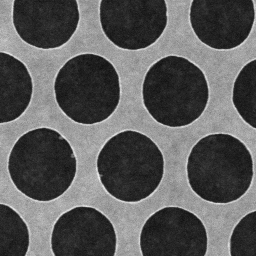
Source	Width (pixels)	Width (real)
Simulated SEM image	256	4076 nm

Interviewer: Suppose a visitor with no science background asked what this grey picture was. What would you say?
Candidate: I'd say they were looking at holes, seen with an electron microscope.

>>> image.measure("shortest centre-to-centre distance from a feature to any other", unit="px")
87.7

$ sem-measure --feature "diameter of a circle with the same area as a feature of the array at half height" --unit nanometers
1090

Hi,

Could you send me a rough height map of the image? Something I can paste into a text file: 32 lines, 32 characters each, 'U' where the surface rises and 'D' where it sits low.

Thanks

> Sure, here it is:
UUDDDDDDDDUUUDDDDDDDDUUUDDDDDDDD
UUDDDDDDDDUUDDDDDDDDDUUUDDDDDDDD
UUDDDDDDDDUUUDDDDDDDDUUUDDDDDDDD
UUDDDDDDDDUUUDDDDDDDDUUUDDDDDDDD
UUDDDDDDDUUUUDDDDDDDUUUUUDDDDDDU
UUUUDDDDUUUUUUDDDDDUUUUUUUDDDDUU
UUUUUUUUUUUUUUUUUUUUUUUUUUUUUUUU
DDUUUUUUUDDDDUUUUUUUDDDUUUUUUUUU
DDDUUUUUDDDDDDUUUUUDDDDDDUUUUUDD
DDDDUUUDDDDDDDDUUUDDDDDDDUUUUUDD
DDDDUUUDDDDDDDDUUUDDDDDDDDUUUDDD
DDDDUUUDDDDDDDDUUUDDDDDDDDUUUDDD
DDDDUUUDDDDDDDDUUUDDDDDDDDUUUDDD
DDDUUUUUDDDDDDUUUUDDDDDDDDUUUDDD
DDUUUUUUDDDDDDUUUUUDDDDDDUUUUUDD
UUUUUUUUUUUUUUUUUUUUDDDDUUUUUUUD
UUUUDDDUUUUUUUUDDUUUUUUUUUUUUUUU
UUDDDDDDUUUUUUDDDDDUUUUUUDDDDDUU
UUDDDDDDDUUUUDDDDDDDUUUUDDDDDDDU
UDDDDDDDDUUUDDDDDDDDUUUUDDDDDDDU
UDDDDDDDDDUUDDDDDDDDUUUDDDDDDDDD
UDDDDDDDDUUUDDDDDDDDUUUDDDDDDDDD
UDDDDDDDDUUUUDDDDDDDUUUUDDDDDDDU
UUDDDDDDDUUUUDDDDDDDUUUUDDDDDDDU
UUUDDDDUUUUUUUDDDDDUUUUUUDDDDDUU
UUUUUUUUUUUUUUUUUUUUUUUUUUUUUUUU
DDUUUUUUDDDDUUUUUUUDDDDDUUUUUUUU
DDDUUUUDDDDDDDUUUUDDDDDDDUUUUUDD
DDDUUUUDDDDDDDUUUUDDDDDDDDUUUDDD
DDDDUUDDDDDDDDUUUUDDDDDDDDUUUDDD
DDDDUUDDDDDDDDDUUUDDDDDDDDUUUDDD
DDDUUUUDDDDDDDUUUUDDDDDDDDUUUDDD